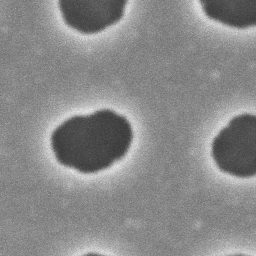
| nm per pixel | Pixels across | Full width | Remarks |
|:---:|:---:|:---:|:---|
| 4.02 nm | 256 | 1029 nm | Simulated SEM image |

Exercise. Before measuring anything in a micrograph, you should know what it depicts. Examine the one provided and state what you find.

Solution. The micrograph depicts holes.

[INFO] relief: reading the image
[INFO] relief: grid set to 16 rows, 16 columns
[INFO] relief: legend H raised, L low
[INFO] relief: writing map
HHHHLLLLHHHHHLLL
HHHHLLLHHHHHHHLL
HHHHHHHHHHHHHHHH
HHHHHHHHHHHHHHHH
HHHHHHHHHHHHHHHH
HHHHHHHHHHHHHHHH
HHHHHHHHHHHHHHHH
HHHHLLLLHHHHHHHL
HHHLLLLLHHHHHHLL
HHHLLLLLHHHHHLLL
HHHHLLLHHHHHHHLL
HHHHHHHHHHHHHHHH
HHHHHHHHHHHHHHHH
HHHHHHHHHHHHHHHH
HHHHHHHHHHHHHHHH
HHHHHHHHHHHHHHHH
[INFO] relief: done